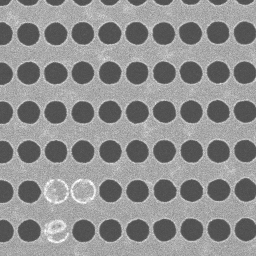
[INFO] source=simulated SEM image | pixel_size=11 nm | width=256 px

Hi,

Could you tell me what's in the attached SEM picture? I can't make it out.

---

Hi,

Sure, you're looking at a regular array of holes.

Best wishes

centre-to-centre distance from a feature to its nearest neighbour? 297 nm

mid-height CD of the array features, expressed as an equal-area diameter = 252 nm